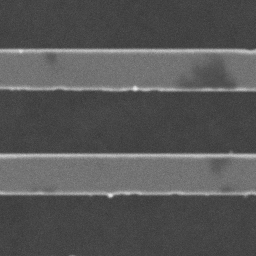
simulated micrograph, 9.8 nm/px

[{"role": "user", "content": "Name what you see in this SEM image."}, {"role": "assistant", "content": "lines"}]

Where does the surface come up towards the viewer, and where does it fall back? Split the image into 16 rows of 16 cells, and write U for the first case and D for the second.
DDDDDDDDDDDDDDDD
DDDDDDDDDDDDDDDD
DDDDDDDDDDDDDDDD
UUUUUUUUUUUUUUUU
UUUUUUUUUUUUUUUU
UUUUUUUUUUUUUUUU
DDDDDDDDDDDDDDDD
DDDDDDDDDDDDDDDD
DDDDDDDDDDDDDDDD
DDDDDDDDDDDDDDDD
UUUUUUUUUUUUUUUU
UUUUUUUUUUUUUUUU
DDDDDDDDDDDDDDDD
DDDDDDDDDDDDDDDD
DDDDDDDDDDDDDDDD
DDDDDDDDDDDDDDDD